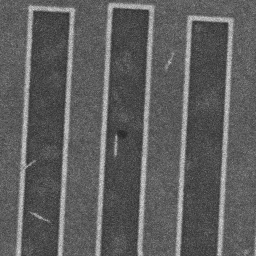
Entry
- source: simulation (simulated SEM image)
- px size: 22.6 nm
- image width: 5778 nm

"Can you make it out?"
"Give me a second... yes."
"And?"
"one or a few lines or trenches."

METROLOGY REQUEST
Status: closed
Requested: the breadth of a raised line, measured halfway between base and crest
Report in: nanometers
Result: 828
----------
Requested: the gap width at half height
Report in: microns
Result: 0.95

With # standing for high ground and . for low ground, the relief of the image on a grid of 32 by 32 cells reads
################################
####.....#####.....#############
####.....#####.....#####....####
####.....#####.....#####.....###
####.....#####.....#####.....###
####.....####......#####.....###
####.....####......####......###
###......####......####......###
###......####......####......###
###......####......####......###
###......####......####......###
###......####.....#####......###
###......####.....#####......###
###......####.....#####.....####
###.....#####.....#####.....####
###.....#####.....#####.....####
###.....#####.....#####.....####
###.....#####.....#####.....####
###.....#####.....#####.....####
###.....#####.....#####.....####
###.....#####.....#####.....####
###.....#####.....#####.....####
###.....#####.....#####.....####
###.....#####.....#####.....####
###.....####......#####.....####
###.....####......#####.....####
###.....####......####......####
##......####......####......####
##......####......####......####
##......####......####......####
##......####......####......####
##......####......####......####